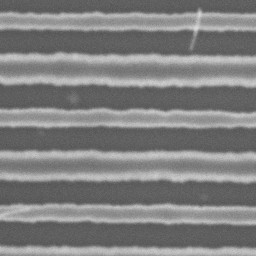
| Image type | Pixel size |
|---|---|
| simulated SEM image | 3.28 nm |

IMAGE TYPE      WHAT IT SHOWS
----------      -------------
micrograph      lines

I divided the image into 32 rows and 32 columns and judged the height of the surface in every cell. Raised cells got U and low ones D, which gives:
DDDDDDDDDDDDDDDDDDDDDDDDDDDDDDDD
DDDDDDDDDDDDDDDDDDDDDDDDDDDDDDDD
UUUUUUUUUUUUUUUUUUUUUUUUUUUUUUUU
UDUUUUUUUUUUUUUUUUUUUUUUUUUUUUUU
DDDDDDDDDDDDDDDDDDDDDDDDDDDDDDDD
DDDDDDDDDDDDDDDDDDDDDDDDDDDDDDDD
DDDDDDDDDDDDDDDDDDDDDDDDDDDDDDDD
UUUUUUUUUUUUUUUUUUUUUUUUUUUUUUUU
UUUUUUUUUUUUUUUUUUUUUUUUUUUUUUUU
UUUUUUUUUUUUUUUUUUUUUUUUUUUUUUUU
DDDDDDDDDDDDDDUUUUUUUUUUUDDDDDUU
DDDDDDDDDDDDDDDDDDDDDDDDDDDDDDDD
DDDDDDDDDDDDDDDDDDDDDDDDDDDDDDDD
DDDDDDDDDDDDDDDDDDDDDDDDDDDDDDDD
UUUUUUUUUUUUUUUUUUUUUUUUUUUUUUUU
UUUUUUUUUUUUUUUUUUUUUUUUUUUUUUUU
DDDDDDDDDDDDDDDDDDDDDDDDDDDDDDDD
DDDDDDDDDDDDDDDDDDDDDDDDDDDDDDDD
DDDDDDDDDDDDDDDDDDDDDDDDDDDDDDDD
UUUUUUUUUUUUUUUUUUUUUUUUUUUUUUUU
UUUUUUUUUUUUUUUUUUUUUUUUUUUUUUUU
UUUUUUUUUUUUUUUUUUUUUUUUUUUUUUUU
DDDDDDDDDDDDDDDDDDDDDDDDDDDDDDUU
DDDDDDDDDDDDDDDDDDDDDDDDDDDDDDDD
DDDDDDDDDDDDDDDDDDDDDDDDDDDDDDDD
DDDDDDDDDDDDDDDDDDDDDDDDDDDDDDDD
UUUUUUUUUUUUUUUUUUUUUUUUUUUUUUUU
UUUUUUUUUUUUUUUUUUUUUUUUUUUUUUUU
DDDDDDDDDDDDDDDDDDDDDDDDDDDDDDDD
DDDDDDDDDDDDDDDDDDDDDDDDDDDDDDDD
DDDDDDDDDDDDDDDDDDDDDDDDDDDDDDDD
UUUUUUUUUUUUUUUUUUUUUUUUUUUUUUUU